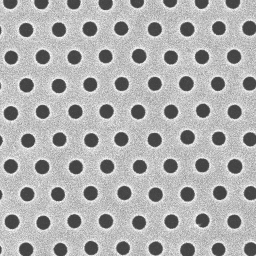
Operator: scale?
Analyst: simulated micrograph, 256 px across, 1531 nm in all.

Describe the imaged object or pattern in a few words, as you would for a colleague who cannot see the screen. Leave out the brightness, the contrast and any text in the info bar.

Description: a regular array of holes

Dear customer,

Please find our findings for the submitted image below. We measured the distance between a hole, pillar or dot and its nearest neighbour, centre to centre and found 184 nm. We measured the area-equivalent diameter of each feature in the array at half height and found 86.3 nanometres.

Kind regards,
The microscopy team